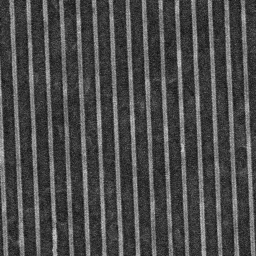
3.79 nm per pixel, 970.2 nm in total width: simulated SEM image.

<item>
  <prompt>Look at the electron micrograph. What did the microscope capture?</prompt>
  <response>parallel lines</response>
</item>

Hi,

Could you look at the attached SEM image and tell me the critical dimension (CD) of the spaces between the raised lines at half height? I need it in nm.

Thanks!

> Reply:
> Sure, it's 49.2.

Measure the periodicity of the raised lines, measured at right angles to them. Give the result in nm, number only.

62.5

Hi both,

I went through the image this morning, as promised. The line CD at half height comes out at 3.01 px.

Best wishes